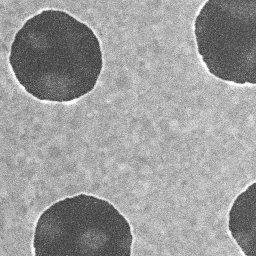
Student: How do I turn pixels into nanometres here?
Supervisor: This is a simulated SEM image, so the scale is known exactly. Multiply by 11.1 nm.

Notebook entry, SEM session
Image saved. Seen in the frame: holes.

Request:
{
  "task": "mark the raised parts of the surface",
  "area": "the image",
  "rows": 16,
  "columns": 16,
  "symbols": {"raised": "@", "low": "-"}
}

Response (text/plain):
@@@@@@@@@@@@@---
@----@@@@@@@----
@-----@@@@@@----
@-----@@@@@@@---
@-----@@@@@@@---
@-----@@@@@@@@@@
@@@@@@@@@@@@@@@@
@@@@@@@@@@@@@@@@
@@@@@@@@@@@@@@@@
@@@@@@@@@@@@@@@@
@@@@@@@@@@@@@@@@
@@@@@@@@@@@@@@@@
@@@@--@@@@@@@@@-
@@@-----@@@@@@--
@@------@@@@@@--
@@------@@@@@@@-